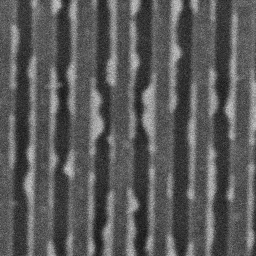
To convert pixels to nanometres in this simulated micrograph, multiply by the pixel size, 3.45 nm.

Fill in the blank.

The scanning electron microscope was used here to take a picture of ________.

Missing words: parallel lines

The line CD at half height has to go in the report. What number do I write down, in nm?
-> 84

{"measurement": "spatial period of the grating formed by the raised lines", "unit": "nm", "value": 138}